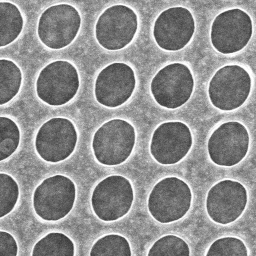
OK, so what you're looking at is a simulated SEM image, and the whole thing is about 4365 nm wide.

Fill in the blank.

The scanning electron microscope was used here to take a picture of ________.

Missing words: a regular array of holes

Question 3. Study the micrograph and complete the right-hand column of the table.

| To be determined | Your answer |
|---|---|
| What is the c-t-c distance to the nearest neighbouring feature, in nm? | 969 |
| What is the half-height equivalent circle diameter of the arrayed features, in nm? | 751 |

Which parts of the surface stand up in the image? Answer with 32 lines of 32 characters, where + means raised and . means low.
..+++++.++++++++++++++++++++++++
...++.....+++....+++....++++...+
...++.....++.....+++....+++....+
...++.....++.....++.....++......
..+++.....++.....++.....++.....+
.++++....++++...++++...++++....+
+++++++++++++++++++++++++++..+++
.+++++++++++++++++++++++++++++++
..+++....++++...++++....++++..++
...++.....++.....++.....+++....+
...++.....++.....++.....++.....+
..+++.....++.....++.....++.....+
.++++....+++....+++.....++.....+
+++++++++++++++++++++.+++++...++
++++++++++++++++++++++++++++++++
..+++....++++...++++...+++++..++
..+++.....++.....++.....+++....+
..++......++.....++.....++.....+
..++.....+++.....++.....++.....+
.++++....+++....+++....+++.....+
+++++++++++++..+++++.++++++...++
++++++++++++++++++++++++++++++++
..+++....++++...++++...+++++.+++
..++.....+++.....++.....++.....+
..++.....++......++.....++.....+
..++.....++......+......++.....+
.+++.....+++....+++....+++....++
++++++.++++++.++++++..+++++..+++
++++++++++++++++++++++++++++++++
..++++..+++++..++++++.++++++++++
..++.....+++....+++....+++.....+
..++.....++.....+++.....++.....+